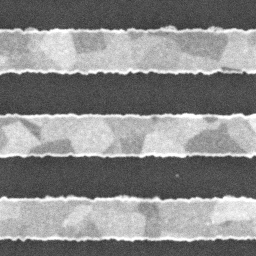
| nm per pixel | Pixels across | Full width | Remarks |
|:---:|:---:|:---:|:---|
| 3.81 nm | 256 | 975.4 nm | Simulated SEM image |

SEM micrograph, lines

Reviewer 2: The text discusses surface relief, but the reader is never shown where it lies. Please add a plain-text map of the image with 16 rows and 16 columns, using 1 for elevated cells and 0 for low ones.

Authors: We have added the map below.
0000000000000000
0000000000000000
1111111111111111
1111111111111111
1001110100111111
0000000000000000
0000000000000000
1111111111111111
1111111111111111
1111111111111111
0000000000000000
0000000000000000
1111111110011111
1111111111111111
1111111111111111
0000000000000000